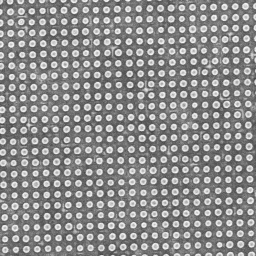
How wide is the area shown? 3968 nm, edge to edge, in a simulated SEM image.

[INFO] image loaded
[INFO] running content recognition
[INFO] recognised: a regular array of raised bodies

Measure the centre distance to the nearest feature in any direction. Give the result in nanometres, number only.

162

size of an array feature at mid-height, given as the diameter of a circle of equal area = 0.0925 µm